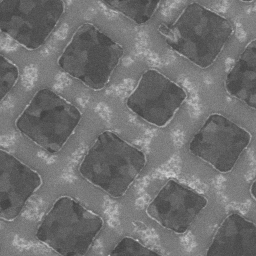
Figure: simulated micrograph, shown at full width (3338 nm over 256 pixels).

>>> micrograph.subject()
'raised bodies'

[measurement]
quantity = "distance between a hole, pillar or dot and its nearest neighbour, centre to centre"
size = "76.3 px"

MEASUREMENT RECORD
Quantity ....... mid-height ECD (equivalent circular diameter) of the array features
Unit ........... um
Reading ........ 0.756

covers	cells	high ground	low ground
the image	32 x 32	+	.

++++++++......++++++....+.......
++++++++.......++++....++++.....
+++++++.........+++...++++++....
+++++++...++........+++++++++...
.+++++...++++........++++++++...
...++....++++++......+++++++...+
........+++++++.......+++++...++
+......++++++++.........+++...++
++......++++++...........+...+++
++.......+++++....+++.......++++
++.........++....+++++......++++
+....++..........++++++.....++++
....++++........+++++++.......++
...+++++++......++++++..........
..++++++++.......+++++....++....
..++++++++.........++....++++...
...++++++....+...........++++++.
....++++....+++.........+++++++.
.....+++...++++++.......+++++++.
++.........+++++++.......+++++..
+++.......++++++++........+++...
++++......+++++++...............
+++++......++++++...............
+++++........+++....+++........+
++++..........+.....+++++.......
+++....+++.........+++++++......
+++...+++++.......+++++++.......
.....++++++++......+++++....+++.
.....++++++++........++....+++++
.....+++++++...............+++++
......+++++....+++........++++++
.......++++...+++++.......++++++